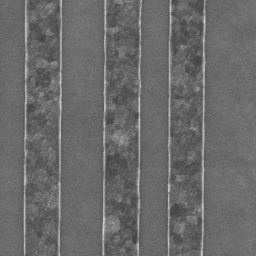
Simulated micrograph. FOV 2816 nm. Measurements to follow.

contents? wiring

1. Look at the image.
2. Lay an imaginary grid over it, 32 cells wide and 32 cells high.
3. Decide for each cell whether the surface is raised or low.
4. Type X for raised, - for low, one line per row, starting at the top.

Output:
---XXXXX-----XXXXX---XXXXX------
---XXXXX-----XXXX----XXXXX------
---XXXXX-----XXXX----XXXXX------
---XXXXX-----XXXX----XXXXX------
---XXXXX-----XXXX----XXXXX------
---XXXXX-----XXXX----XXXX-------
---XXXXX-----XXXX----XXXX-------
---XXXXX-----XXXX----XXXXX------
---XXXXX-----XXXX----XXXXX------
---XXXXX-----XXXX----XXXX-------
---XXXXX-----XXXX----XXXX-------
---XXXXX-----XXXX----XXXX-------
---XXXXX-----XXXX----XXXX-------
---XXXXX-----XXXX----XXXX-------
---XXXXX-----XXXX----XXXX-------
---XXXX------XXXX----XXXX-------
---XXXX------XXXX----XXXX-------
---XXXX------XXXX----XXXX-------
---XXXX------XXXX----XXXX-------
---XXXX------XXXX----XXXX-------
---XXXX------XXXX----XXXX-------
---XXXX------XXXX----XXXX-------
---XXXX------XXXX----XXXX-------
---XXXX------XXXX----XXXX-------
---XXXX------XXXX----XXXX-------
---XXXX------XXXX----XXXX-------
---XXXX------XXXX----XXXX-------
---XXXX------XXXX----XXXX-------
---XXXX------XXXX----XXXX-------
---XXXX------XXXX----XXXX-------
---XXXX------XXXX----XXXX-------
---XXXX------XXXX----XXXX-------